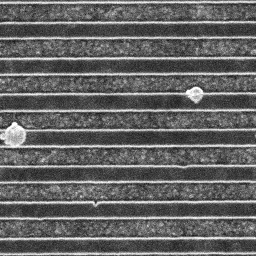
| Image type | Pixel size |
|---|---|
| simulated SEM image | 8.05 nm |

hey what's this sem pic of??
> parallel lines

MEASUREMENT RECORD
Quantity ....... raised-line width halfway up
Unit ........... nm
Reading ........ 132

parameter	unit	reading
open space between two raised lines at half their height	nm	159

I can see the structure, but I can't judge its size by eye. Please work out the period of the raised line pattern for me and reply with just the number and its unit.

290 nanometers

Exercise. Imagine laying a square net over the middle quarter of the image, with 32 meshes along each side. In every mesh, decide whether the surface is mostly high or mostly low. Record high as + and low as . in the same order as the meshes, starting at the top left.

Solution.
++++++++++++++++++++++++++++++++
++++++++++++++++++++++++++++++++
++++++++++++++++++++++++........
................................
................................
................................
...............................+
................++++++++++++++++
++++++++++++++++++++++++++++++++
++++++++++++++++++++++++++++++++
++++++++++++++++++++++++++++++++
+++++++++++++++++++++++++++++...
................................
................................
................................
................................
......................++++++++++
++++++++++++++++++++++++++++++++
++++++++++++++++++++++++++++++++
++++++++++++++++++++++++++++++++
++++++++++++++++++++++++++++++++
................................
................................
................................
................................
...........................++..+
++++++++++++++++++++++++++++++++
++++++++++++++++++++++++++++++++
++++++++++++++++++++++++++++++++
...++..+++++++......+++++.++.++.
................................
................................